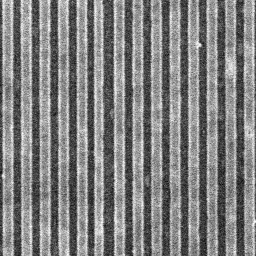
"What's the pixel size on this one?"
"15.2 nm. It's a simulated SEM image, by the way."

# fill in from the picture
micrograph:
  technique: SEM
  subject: parallel lines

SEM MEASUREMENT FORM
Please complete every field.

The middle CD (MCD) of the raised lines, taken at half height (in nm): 135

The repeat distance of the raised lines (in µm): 0.283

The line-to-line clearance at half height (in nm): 149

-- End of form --